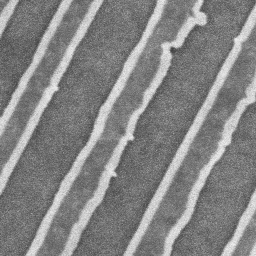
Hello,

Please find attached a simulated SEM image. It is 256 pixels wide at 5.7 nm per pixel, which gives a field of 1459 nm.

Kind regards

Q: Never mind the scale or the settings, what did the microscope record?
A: one or a few lines or trenches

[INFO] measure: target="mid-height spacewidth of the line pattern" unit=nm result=321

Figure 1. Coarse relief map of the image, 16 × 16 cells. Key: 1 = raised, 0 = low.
1000110000110000
0001100000110000
0001100001100001
0011000011000001
0011000011000011
0110000111000111
0110000110000110
1100001100001110
1100001100001100
1000011000011100
1000011000011000
0000110000110000
0000110000110000
0001100001110001
0001100001100001
0011000011000011